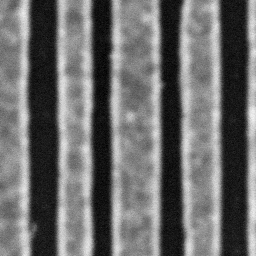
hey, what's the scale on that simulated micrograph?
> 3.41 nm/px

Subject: one or a few lines or trenches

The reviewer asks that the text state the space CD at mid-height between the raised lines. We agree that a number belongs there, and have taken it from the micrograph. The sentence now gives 114 nm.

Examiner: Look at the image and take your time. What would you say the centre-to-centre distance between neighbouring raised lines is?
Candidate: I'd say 216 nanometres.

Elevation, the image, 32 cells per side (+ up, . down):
+++.....+++....++++....++++.....
+++.....+++....++++....++++.....
+++.....+++....++++....++++.....
+++.....+++....++++....++++.....
+++.....+++....+++++...++++.....
+++.....+++....+++++...++++.....
+++.....+++....+++++...++++.....
+++.....+++...+++++....++++.....
+++.....+++....+++++...++++.....
+++.....+++....+++++...++++.....
+++.....+++....+++++...++++.....
+++.....+++...++++++...++++.....
+++.....+++...++++++...++++.....
+++.....+++...++++++...++++.....
+++.....+++...++++++...++++.....
+++.....+++...++++++...++++.....
+++.....+++....+++++...++++.....
+++.....+++....+++++...++++.....
+++.....+++....+++++...++++.....
+++.....+++....+++++...++++.....
+++.....+++....+++++...++++.....
+++.....+++....+++++...++++.....
+++.....+++....+++++...++++.....
+++.....+++....++++....++++.....
+++.....+++....+++++...++++.....
+++.....+++....++++....++++.....
+++.....+++....++++....++++.....
+++.....+++....++++....++++....+
+++.....+++....++++....++++....+
+++.....+++....++++.....+++....+
+++.....+++....++++.....+++.....
+++.....+++....++++.....+++.....